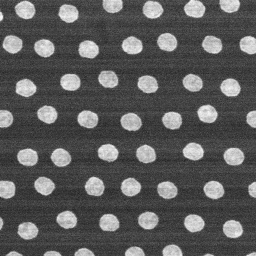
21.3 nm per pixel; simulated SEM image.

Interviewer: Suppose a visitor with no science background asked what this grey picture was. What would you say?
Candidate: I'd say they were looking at a regular array of raised bodies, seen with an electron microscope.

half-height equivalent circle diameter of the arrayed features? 383 nanometres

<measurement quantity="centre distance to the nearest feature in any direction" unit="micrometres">0.768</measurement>